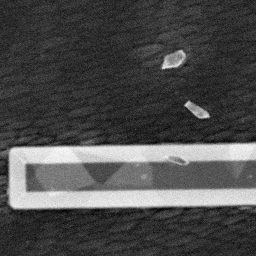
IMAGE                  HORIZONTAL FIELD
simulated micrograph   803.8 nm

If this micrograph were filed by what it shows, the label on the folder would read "one or a few lines or trenches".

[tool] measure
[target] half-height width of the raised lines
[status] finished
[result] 150 nm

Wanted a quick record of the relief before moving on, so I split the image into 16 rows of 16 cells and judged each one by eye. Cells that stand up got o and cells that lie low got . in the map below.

................
................
................
................
................
................
................
................
................
...........ooooo
.ooooooooooooooo
.ooooooooooooooo
.oooooo.........
................
................
................